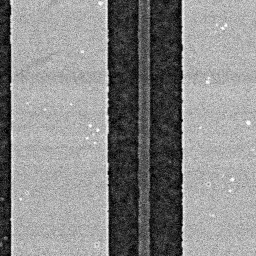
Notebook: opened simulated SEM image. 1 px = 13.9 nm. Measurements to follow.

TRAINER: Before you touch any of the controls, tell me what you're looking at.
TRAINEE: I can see lines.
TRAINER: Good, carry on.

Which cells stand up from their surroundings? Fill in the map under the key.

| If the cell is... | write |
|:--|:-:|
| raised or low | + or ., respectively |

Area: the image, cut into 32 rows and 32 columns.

.++++++++++++....++....+++++++++
.++++++++++++....++....+++++++++
.++++++++++++....++....+++++++++
.++++++++++++....++....+++++++++
.++++++++++++....++....+++++++++
.++++++++++++....++....+++++++++
.++++++++++++....++....+++++++++
.++++++++++++....++....+++++++++
.++++++++++++....++....+++++++++
.++++++++++++....++....+++++++++
.++++++++++++....++....+++++++++
.++++++++++++....++....+++++++++
.++++++++++++....++....+++++++++
.++++++++++++....++....+++++++++
.++++++++++++....++....+++++++++
.++++++++++++....++....+++++++++
.++++++++++++....++....+++++++++
.++++++++++++....++....+++++++++
.++++++++++++....++....+++++++++
.++++++++++++....++....+++++++++
.++++++++++++....++....+++++++++
.++++++++++++....++....+++++++++
.++++++++++++....++....+++++++++
.++++++++++++....++....+++++++++
.++++++++++++.....+....+++++++++
.++++++++++++....++....+++++++++
.++++++++++++....++....+++++++++
.++++++++++++....++....+++++++++
.++++++++++++....++....+++++++++
.++++++++++++....++....+++++++++
.++++++++++++....++....+++++++++
.++++++++++++....++....+++++++++